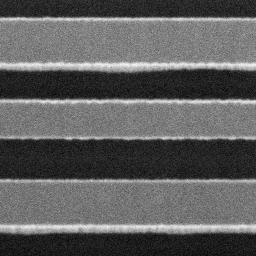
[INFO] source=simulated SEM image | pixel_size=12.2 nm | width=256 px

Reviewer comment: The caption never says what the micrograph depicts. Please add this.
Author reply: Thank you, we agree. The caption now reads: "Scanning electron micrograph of lines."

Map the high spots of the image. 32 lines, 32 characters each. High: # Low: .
................................
................................
################################
################################
################################
################################
################################
################################
................................
................................
................................
................................
................................
################################
################################
################################
################################
................................
................................
................................
................................
................................
#...............................
################################
################################
################################
################################
################################
.#.###.#.......#..##.####.......
................................
................................
................................